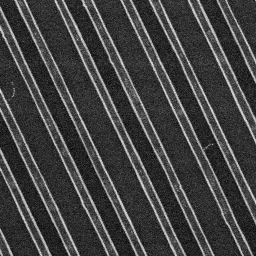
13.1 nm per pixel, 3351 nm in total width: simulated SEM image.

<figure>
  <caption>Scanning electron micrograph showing parallel lines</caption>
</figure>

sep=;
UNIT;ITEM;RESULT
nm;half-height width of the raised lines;111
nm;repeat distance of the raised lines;396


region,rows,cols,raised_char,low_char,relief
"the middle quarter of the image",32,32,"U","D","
DDDDDUUUDDDDUUUDDDDDDDUUUDDDDDUU
DDDDDDUUDDDDDUUDDDDDDDDUUDDDDDUU
DDDDDDUUUDDDDUUUDDDDDDDUUUDDDDDU
DDDDDDDUUDDDDDUUDDDDDDDDUUDDDDDU
DDDDDDDUUUDDDDUUUDDDDDDDUUUDDDDU
DDDDDDDDUUDDDDDUUDDDDDDDDUUDDDDD
UDDDDDDDUUUDDDDUUUDDDDDDDUUDDDDD
UDDDDDDDDUUDDDDDUUDDDDDDDUUUDDDD
UUDDDDDDDUUDDDDDUUUDDDDDDDUUDDDD
UUDDDDDDDDUUDDDDDUUDDDDDDDUUUDDD
UUUDDDDDDDUUDDDDDUUUDDDDDDDUUDDD
DUUDDDDDDDDUUDDDDDUUDDDDDDDUUUDD
DUUUDDDDDDDUUDDDDDUUUDDDDDDDUUDD
DDUUDDDDDDDDUUDDDDDUUDDDDDDDUUUD
DDUUUDDDDDDDUUDDDDDUUDDDDDDDDUUD
DDDUUDDDDDDDDUUDDDDDUUDDDDDDDUUU
DDDUUUDDDDDDDUUDDDDDUUDDDDDDDDUU
DDDDUUDDDDDDDDUUDDDDDUUDDDDDDDUU
DDDDUUUDDDDDDDUUDDDDDUUDDDDDDDDU
DDDDDUUDDDDDDDDUUDDDDDUUDDDDDDDU
DDDDDUUDDDDDDDDUUDDDDDUUDDDDDDDD
UDDDDDUUDDDDDDDDUUDDDDDUUDDDDDDD
UDDDDDUUDDDDDDDDUUDDDDDUUDDDDDDD
UUDDDDUUUDDDDDDDDUUDDDDDUUDDDDDD
UUDDDDDUUDDDDDDDDUUDDDDDUUDDDDDD
UUUDDDDUUUDDDDDDDUUUDDDDDUUDDDDD
DUUDDDDDUUDDDDDDDDUUDDDDDUUDDDDD
DUUUDDDDUUUDDDDDDDUUUDDDDDUUDDDD
DDUUDDDDDUUDDDDDDDDUUDDDDDUUDDDD
DDUUUDDDDUUUDDDDDDDUUUDDDDDUUDDD
DDDUUDDDDDUUDDDDDDDDUUDDDDDUUDDD
DDDUUUDDDDUUUDDDDDDDUUUDDDDDUUDD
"